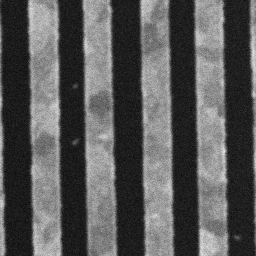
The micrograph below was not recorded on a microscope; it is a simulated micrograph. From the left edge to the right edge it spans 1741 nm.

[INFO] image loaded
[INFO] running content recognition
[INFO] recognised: lines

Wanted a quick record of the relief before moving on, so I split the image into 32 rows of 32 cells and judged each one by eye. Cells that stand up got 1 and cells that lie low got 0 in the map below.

00001110000111000011100001110001
00001110000111000011100001110001
00001110000111000011100001110001
00001110000111000011100001110001
00001110000111000011100001110000
00001110000111000011100001110000
00001110000111000011100001110000
00001110000111000011100001110000
00001110000111000011100001110000
00001110000111000011100001110000
00001110000111000011100001110000
00001110000111000011100001110000
00001110000111000011100001110000
00001110000111000011100001110000
00001110000111000011100001110000
00001110000111000011100001110000
00001110000111000011100001110000
00001110000111000011100001110000
00001110000111000011100001110000
00001110000111000011100001110000
00001110000111000011100001110000
00001110000111000011100001110000
00001110000111000011100001110000
00001110000111000011100001110000
00001110000111000011100001110000
00001110000111000011100001110000
00001110000111000011100001110000
00001110000111000011100001110000
00001110000111000011100001110000
00001110000111000011100001110000
00001110000111000011100001110000
00001110000111000011100001110000